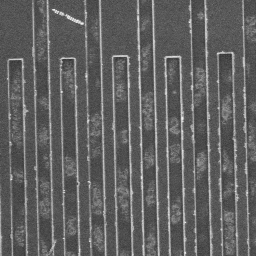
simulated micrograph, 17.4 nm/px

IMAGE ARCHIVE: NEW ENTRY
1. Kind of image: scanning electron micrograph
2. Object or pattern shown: parallel lines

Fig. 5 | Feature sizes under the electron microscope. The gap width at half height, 244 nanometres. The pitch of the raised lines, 457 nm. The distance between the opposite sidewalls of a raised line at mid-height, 211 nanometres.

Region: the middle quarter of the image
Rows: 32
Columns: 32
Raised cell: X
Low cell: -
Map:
---XXX---XXX----XXX----XX----XXX
---XXX---XXX----XXX----XX----XXX
---XXX---XXX----XXX----XXX---XXX
---XXX---XXX----XXX----XXX---XXX
---XXX---XXX----XXX----XX----XXX
---XXX---XXX----XXX----XX----XXX
---XXX----XX----XXX----XX----XXX
---XXX----XX----XXX----XX----XXX
---XXX----XX----XXX----XX----XXX
---XXX----XX----XXX----XX----XXX
---XXX----XX----XXX----XX----XXX
---XXX---XXX----XXX----XXX---XXX
---XXX---XXX----XXX----XXX----XX
---XXX----XX----XXX----XXX----XX
---XXX----XX----XXX----XXX----XX
---XXX----XXX---XXX----XXX----XX
---XXX----XXX----XX----XXX----XX
---XXX----XXX----XX----XXX----XX
---XXX----XXX----XX----XXX----XX
---XXX----XXX----XX----XXX----XX
---XXX----XXX----XX----XXX----XX
---XXX----XXX----XX----XXX----XX
---XXX----XXX----XX----XXX----XX
---XXX----XXX----XX----XXX----XX
---XXX----XXX----XXX---XXX----XX
---XXX----XXX----XX----XXX----XX
---XXX----XXX----XX----XXX----XX
---XXX----XXX----XX----XXX----XX
---XXX----XXX----XX----XXX----XX
---XXXX---XXX----XXX---XXX----XX
----XXX---XXX----XXX---XXX----XX
----XX----XXX----XX----XXX----XX